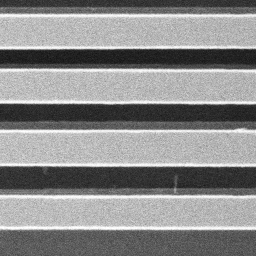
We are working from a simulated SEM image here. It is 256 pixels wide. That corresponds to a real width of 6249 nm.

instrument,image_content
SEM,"lines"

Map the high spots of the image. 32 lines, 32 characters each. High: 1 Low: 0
00000000000000000000000000000000
00000000000000000000000000000000
11111111111111111111111111111111
11111111111111111111111111111111
11111111111111111111111111111111
11111111111111111111111111111111
00000000000000000000000000000000
00000000000000000000000000000000
00000000000000000000000000000000
11111111111111111111111111111111
11111111111111111111111111111111
11111111111111111111111111111111
11111111111111111111111111111111
00000000000000000000000000000000
00000000000000000000000000000000
00000000000000000000000000000000
11111111111111111111111111111111
11111111111111111111111111111111
11111111111111111111111111111111
11111111111111111111111111111111
11111111111111111111111111111111
00000000000000000000000000000000
00000000000000000000000000000000
00000000000000000000000000000000
11111111111111111111111111111011
11111111111111111111111111111111
11111111111111111111111111111111
11111111111111111111111111111111
11111111111111111111111111111111
00000000000000000000000000000000
00000000000000000000000000000000
00000000000000000000000000000000